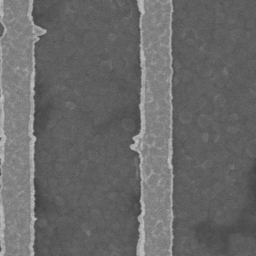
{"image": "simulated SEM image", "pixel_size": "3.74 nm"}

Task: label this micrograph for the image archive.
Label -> one or a few lines or trenches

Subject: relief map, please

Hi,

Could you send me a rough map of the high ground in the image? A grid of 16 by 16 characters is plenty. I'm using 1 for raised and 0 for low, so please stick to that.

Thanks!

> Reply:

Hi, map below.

1100000001100000
1100000001100000
1100000001100000
1100000001100000
1100000001100000
1100000001100000
1100000001100000
1100000001100000
1100000001100000
1100000001100000
1100000001100000
1100000001100000
1100000001100000
1100000001100000
1100000001100000
1100000001100000